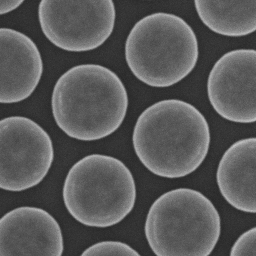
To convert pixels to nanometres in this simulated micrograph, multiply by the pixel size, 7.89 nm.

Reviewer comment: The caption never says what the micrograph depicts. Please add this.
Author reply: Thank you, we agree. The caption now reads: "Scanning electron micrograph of raised bodies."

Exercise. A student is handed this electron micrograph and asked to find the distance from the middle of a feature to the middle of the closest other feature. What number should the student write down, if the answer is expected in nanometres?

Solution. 703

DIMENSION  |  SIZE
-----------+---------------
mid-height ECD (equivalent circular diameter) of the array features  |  581 nm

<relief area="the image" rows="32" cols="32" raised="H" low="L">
HHLLLHHHHHHHHHLLLLLLLLLLLHHHHHHH
HLLLLHHHHHHHHHLLLLLLLLLLLHHHHHHH
LLLLLHHHHHHHHHLLLLHHHHHLLHHHHHHH
LLLLLHHHHHHHHHLLLHHHHHHHLLHHHHHH
HHHLLLHHHHHHHHLLHHHHHHHHLLLLLLLL
HHHHLLLHHHHHHLLLHHHHHHHHHLLLLLLL
HHHHHLLLLLLLLLLLHHHHHHHHHLLLLHHH
HHHHHLLLLLLLLLLLHHHHHHHHLLLHHHHH
HHHHHLLLLHHHHLLLHHHHHHHHLLLHHHHH
HHHHHLLLHHHHHHLLLHHHHHHLLLHHHHHH
HHHHHLLHHHHHHHHLLLHHHHLLLLHHHHHH
HHHHLLLHHHHHHHHHLLLLLLLLLLHHHHHH
HHHLLLLHHHHHHHHHLLLLLHLLLLHHHHHH
LLLLLLLHHHHHHHHHLLLHHHHHLLLHHHHH
LLLLLLLHHHHHHHHLLLHHHHHHHLLLHHHH
HHHHLLLHHHHHHHHLLHHHHHHHHHLLLLLL
HHHHHHLLHHHHHHLLLHHHHHHHHHLLLLLL
HHHHHHLLLLLLLLLLLHHHHHHHHHLLLLLH
HHHHHHLLLLLLLLLLLHHHHHHHHHLLLHHH
HHHHHHHLLLLHHLLLLHHHHHHHHHLLHHHH
HHHHHHLLLHHHHHHLLLHHHHHHHLLHHHHH
HHHHHHLLLHHHHHHHLLLHHHHHLLLHHHHH
HHHHHLLLHHHHHHHHHLLLLLLLLLLHHHHH
HHHLLLLLHHHHHHHHHLLLLLLLLLLHHHHH
LLLLLLLLHHHHHHHHHLLLHHHHHLLLHHHH
LLLLLLLLHHHHHHHHHLLHHHHHHHLLLHHH
LHHHHHLLLHHHHHHHLLLHHHHHHHHLLLLL
HHHHHHHLLLHHHHHLLLHHHHHHHHHLLLLL
HHHHHHHLLLLLLLLLLLHHHHHHHHHLLLLL
HHHHHHHHLLLLLLLLLLHHHHHHHHHLLLHH
HHHHHHHHLLLLHHHLLLLHHHHHHHHLLHHH
HHHHHHHHLLLHHHHHHLLHHHHHHHLLLHHH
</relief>